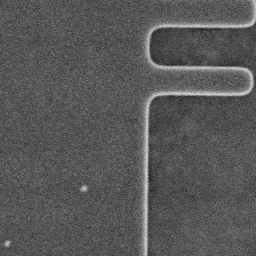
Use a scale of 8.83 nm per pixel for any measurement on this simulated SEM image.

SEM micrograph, wiring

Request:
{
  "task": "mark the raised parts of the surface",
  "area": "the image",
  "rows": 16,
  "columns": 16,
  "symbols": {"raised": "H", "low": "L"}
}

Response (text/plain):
HHHHHHHHHHHHHHHH
HHHHHHHHHHHHHHHH
HHHHHHHHHLLLLLLL
HHHHHHHHHLLLLLLL
HHHHHHHHHHHHHHHL
HHHHHHHHHHHHHHHH
HHHHHHHHHLLLLLLL
HHHHHHHHHLLLLLLL
HHHHHHHHHLLLLLLL
HHHHHHHHHLLLLLLL
HHHHHHHHHLLLLLLL
HHHHHHHHHLLLLLLL
HHHHHHHHHLLLLLLL
HHHHHHHHHLLLLLLL
HHHHHHHHHLLLLLLL
HHHHHHHHHLLLLLLL